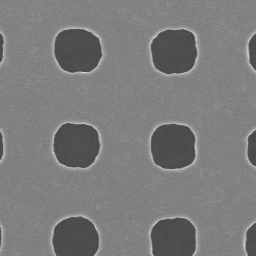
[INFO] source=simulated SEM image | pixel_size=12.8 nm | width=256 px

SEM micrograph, holes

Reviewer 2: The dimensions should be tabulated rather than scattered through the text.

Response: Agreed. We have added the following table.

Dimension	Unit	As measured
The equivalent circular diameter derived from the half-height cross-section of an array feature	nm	606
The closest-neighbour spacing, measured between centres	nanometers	1220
